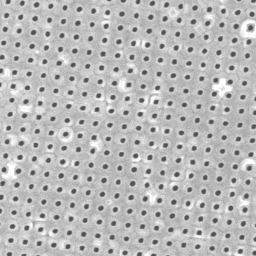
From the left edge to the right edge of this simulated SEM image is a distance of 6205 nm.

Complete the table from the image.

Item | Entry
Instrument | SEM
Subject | a regular array of holes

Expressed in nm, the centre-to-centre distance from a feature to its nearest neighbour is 334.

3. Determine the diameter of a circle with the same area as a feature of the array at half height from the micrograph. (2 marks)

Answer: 142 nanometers